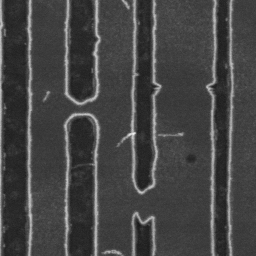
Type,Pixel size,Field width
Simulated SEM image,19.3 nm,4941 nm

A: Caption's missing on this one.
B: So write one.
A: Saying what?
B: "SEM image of one or a few lines or trenches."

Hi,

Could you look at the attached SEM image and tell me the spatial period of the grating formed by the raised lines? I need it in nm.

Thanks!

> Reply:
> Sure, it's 1310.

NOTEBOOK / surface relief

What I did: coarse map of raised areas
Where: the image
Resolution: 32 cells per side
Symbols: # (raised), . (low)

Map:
....####....#####..########..###
....####....#####..########..###
....####....#####..########..###
....####....#####..########..###
....####....#####..########..###
....####....#####..########..###
....####....#####..########..###
....####....#####..########..###
....####....#####..########..###
....####....#####..########..###
....####....#####..#######...###
....####....#####..#######...###
....#####..######..########..###
....#############..########..###
....#####..######..########..###
....####....#####..########..###
....####....#####..########..###
....####....#####..########..###
....####....#####..########..###
....#####...#####...#######..###
....#####...#####..########..###
....####....#####..########..###
....####....#####..########..###
....####....#####..########..###
....####....###############..###
....####....##############...###
....####....##############...###
....####....##############...###
....####....#####..#######...###
....####....#####..########..###
....####....#####..########..###
....####....#####..########..###